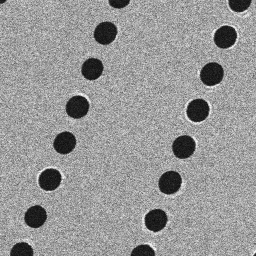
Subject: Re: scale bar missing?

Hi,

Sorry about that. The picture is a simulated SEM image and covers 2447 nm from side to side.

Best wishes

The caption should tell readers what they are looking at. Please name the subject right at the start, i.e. a regular array of holes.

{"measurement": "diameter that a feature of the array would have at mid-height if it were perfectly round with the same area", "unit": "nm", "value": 224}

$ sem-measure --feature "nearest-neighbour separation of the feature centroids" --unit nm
369